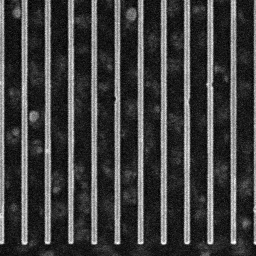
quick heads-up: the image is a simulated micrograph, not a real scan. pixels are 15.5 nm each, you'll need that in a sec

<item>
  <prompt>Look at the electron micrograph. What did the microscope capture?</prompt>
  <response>parallel lines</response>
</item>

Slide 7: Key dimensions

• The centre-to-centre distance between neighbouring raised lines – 360 nm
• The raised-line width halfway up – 58.1 nanometres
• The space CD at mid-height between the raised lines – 291 nanometers